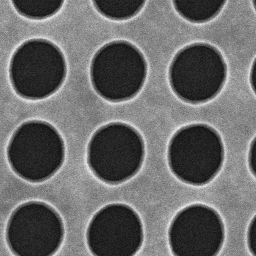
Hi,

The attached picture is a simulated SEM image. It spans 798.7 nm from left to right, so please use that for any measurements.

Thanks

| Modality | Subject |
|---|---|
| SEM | holes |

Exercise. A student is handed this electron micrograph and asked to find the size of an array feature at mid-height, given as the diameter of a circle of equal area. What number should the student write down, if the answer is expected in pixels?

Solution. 57.4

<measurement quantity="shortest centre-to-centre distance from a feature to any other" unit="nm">249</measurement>